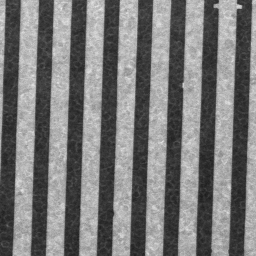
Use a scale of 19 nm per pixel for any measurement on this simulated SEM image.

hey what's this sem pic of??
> parallel lines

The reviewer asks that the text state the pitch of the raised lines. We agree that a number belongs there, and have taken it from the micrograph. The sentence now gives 628 nm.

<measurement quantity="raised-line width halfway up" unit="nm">332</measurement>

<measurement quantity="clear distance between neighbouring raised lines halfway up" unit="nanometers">294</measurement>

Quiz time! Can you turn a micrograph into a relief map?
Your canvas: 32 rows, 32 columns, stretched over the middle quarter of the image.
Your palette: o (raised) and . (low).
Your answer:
o....ooooo....oooo....oooo....oo
o....ooooo...ooooo....oooo....oo
o....oooo....ooooo....oooo....oo
o....oooo....ooooo....oooo....oo
o....oooo.....oooo....oooo....oo
o....oooo....ooooo....oooo....oo
o....oooo....ooooo....oooo....oo
o....oooo....ooooo....oooo....oo
o....oooo....ooooo....oooo....oo
o....oooo....ooooo....oooo....oo
o....oooo....oooo.....oooo....oo
o....oooo....oooo.....oooo....oo
o....oooo....oooo.....oooo....oo
o....oooo....oooo....ooooo....oo
o....oooo....oooo....ooooo....oo
o....oooo....oooo....ooooo....oo
o....oooo....oooo....ooooo....oo
o....oooo....oooo....ooooo....oo
o....oooo....oooo....oooo.....oo
o....oooo....oooo....oooo.....oo
o....oooo....oooo....oooo.....oo
o....oooo....oooo....oooo....ooo
o....oooo....oooo....oooo....ooo
o....oooo....oooo....oooo....ooo
o....oooo....oooo....oooo....ooo
.....oooo....oooo....oooo....ooo
.....oooo....oooo....oooo....ooo
.....oooo....oooo....oooo....ooo
....ooooo....oooo....oooo....ooo
....ooooo....oooo....oooo....ooo
....ooooo....oooo....oooo....ooo
....ooooo....oooo....oooo....ooo